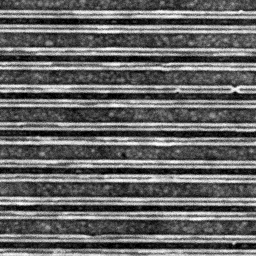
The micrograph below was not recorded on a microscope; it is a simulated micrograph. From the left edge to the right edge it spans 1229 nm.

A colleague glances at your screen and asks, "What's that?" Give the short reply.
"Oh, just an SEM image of parallel lines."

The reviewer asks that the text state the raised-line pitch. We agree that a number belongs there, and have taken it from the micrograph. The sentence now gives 18.7 pixels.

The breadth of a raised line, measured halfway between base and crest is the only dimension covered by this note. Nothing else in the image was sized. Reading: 33 nm